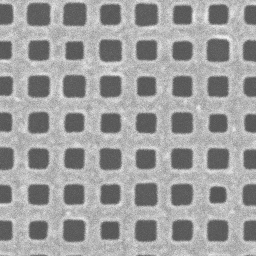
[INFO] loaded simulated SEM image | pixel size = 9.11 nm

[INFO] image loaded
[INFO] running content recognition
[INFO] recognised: a regular array of holes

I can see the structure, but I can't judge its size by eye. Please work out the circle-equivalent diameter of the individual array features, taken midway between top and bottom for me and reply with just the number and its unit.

0.213 µm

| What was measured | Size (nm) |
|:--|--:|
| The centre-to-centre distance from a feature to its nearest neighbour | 324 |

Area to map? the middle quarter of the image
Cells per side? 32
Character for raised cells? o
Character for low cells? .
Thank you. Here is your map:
oooooooooooooooooooooooooooooooo
oooooooooooooooooooooooooooooooo
oooooooooooooooooooooooooooooooo
......ooo.....oooo.....oooo.....
......ooo.....oooo.....oooo.....
......ooo.....oooo.....oooo.....
......ooo......ooo.....oooo.....
.....oooo.....oooo.....oooo.....
o...oooooooooooooooooooooooooooo
oooooooooooooooooooooooooooooooo
oooooooooooooooooooooooooooooooo
oooooooooooooooooooooooooooooooo
o....oooo.....oooo.....oooo.....
.....oooo.....oooo.....oooo.....
.....oooo.....oooo.....oooo.....
.....oooo.....oooo.....oooo.....
.....oooo.....oooo.....oooo.....
oooooooooooooooooooooooooooooooo
oooooooooooooooooooooooooooooooo
oooooooooooooooooooooooooooooooo
oooooooooooooooooooooooooooooooo
o....oooo.....oooo.....oooo.....
.....oooo......ooo.....oooo.....
.....oooo......ooo.....oooo.....
.....oooo......ooo.....oooo.....
.....oooo.....oooo.....oooo.....
oooooooooo...oooooo...ooooooo..o
oooooooooooooooooooooooooooooooo
oooooooooooooooooooooooooooooooo
oooooooooooooooooooooooooooooooo
.....oooo.....oooo.....oooo.....
.....oooo.....oooo......ooo.....